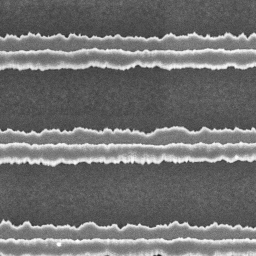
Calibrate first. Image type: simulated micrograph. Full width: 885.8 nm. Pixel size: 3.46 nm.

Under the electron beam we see lines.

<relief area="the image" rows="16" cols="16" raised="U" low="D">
DDDDDDDDDDDDDDDD
DDDDDDDDDDDDDDDD
UUUUUUUUUUUUUUUU
UUUUUUUUUUUUUUUU
DDDDDDDDDDDDDDDD
DDDDDDDDDDDDDDDD
DDDDDDDDDDDDDDDD
DDDDDDDDDDDDDDDD
UUUUUUUUUUUUUUUU
UUUUUUUUUUUUUUUU
DDDDDDDDDDDDDDDD
DDDDDDDDDDDDDDDD
DDDDDDDDDDDDDDDD
DDDDDDDDDDDDDDDD
UUUUUUUUUUUUUUUU
UUUUUUUUUUUUUUUU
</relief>